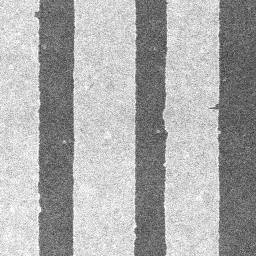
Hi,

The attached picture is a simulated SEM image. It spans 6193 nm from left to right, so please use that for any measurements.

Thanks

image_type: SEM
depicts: one or a few lines or trenches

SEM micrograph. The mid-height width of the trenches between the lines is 812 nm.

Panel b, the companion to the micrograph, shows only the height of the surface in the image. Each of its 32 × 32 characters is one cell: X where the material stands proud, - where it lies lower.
XXXXX----XXXXXXXX----XXXXXX-----
XXXX-----XXXXXXXX----XXXXXX-----
XXXXX----XXXXXXXX----XXXXXX-----
XXXXX----XXXXXXXX----XXXXXX-----
XXXXX----XXXXXXXX----XXXXXX-----
XXXXX----XXXXXXXX----XXXXXX-----
XXXXX----XXXXXXXX----XXXXXX-----
XXXXX----XXXXXXXX----XXXXXX-----
XXXXX----XXXXXXXX----XXXXXX-----
XXXXX----XXXXXXXX----XXXXXX-----
XXXXX----XXXXXXXX----XXXXXX-----
XXXXX----XXXXXXXX----XXXXXX-----
XXXXX----XXXXXXXX----XXXXXX-----
XXXXX----XXXXXXXX----XXXXXX-----
XXXXX----XXXXXXXX---XXXXXXX-----
XXXXX----XXXXXXXX----XXXXXX-----
XXXXX----XXXXXXXX----XXXXXX-----
XXXXX----XXXXXXXX----XXXXXX-----
XXXXX----XXXXXXXX----XXXXXX-----
XXXXX----XXXXXXXX----XXXXXX-----
XXXXX----XXXXXXXX----XXXXXX-----
XXXXX----XXXXXXXX----XXXXXX-----
XXXXX----XXXXXXXX----XXXXXX-----
XXXXX----XXXXXXXX----XXXXXX-----
XXXXX----XXXXXXXX----XXXXXX-----
XXXXX----XXXXXXXX----XXXXXX-----
XXXXX----XXXXXXXX----XXXXXX-----
XXXXX----XXXXXXXX----XXXXXX-----
XXXXX----XXXXXXXX----XXXXXX-----
XXXXX----XXXXXXXX----XXXXXX-----
XXXXX----XXXXXXXX----XXXXXX-----
XXXXX----XXXXXXXX----XXXXXX-----